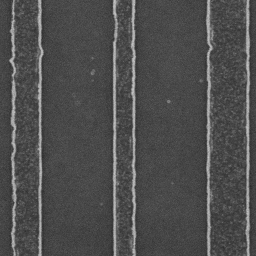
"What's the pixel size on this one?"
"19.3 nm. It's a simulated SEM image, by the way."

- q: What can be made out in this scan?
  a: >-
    one or a few lines or trenches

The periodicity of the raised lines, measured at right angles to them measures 1.95 micrometres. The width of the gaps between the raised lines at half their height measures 1440 nanometres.